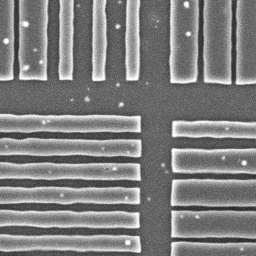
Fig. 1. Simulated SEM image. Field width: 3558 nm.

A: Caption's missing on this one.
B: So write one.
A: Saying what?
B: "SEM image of groups of lines, slits or small figures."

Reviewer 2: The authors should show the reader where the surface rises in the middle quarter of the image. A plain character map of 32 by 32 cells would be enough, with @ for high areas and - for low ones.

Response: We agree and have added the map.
@@-----@@@------@@@--------@@@@@
@@-----@@@------@@@--------@@@@@
@@-----@@@------@@@--------@@@@@
@@-----@@@------@@---------@@@@@
-----------------------------@@-
--------------------------------
--------------------------------
--------------------------------
--------------------------------
--------------------------------
--------------------------------
--------------------------------
--------------------------------
@@@@@@@@@@@@@@@@@@@-------------
@@@@@@@@@@@@@@@@@@@-------------
@@@@@@@@@@@@@@@@@@@--------@@@@@
@@@@@@@@@@@@@@@@@@@--------@@@@@
---------------------------@@@@@
--------------------------------
@@@@@@@@@@@@@@@@@@@-------------
@@@@@@@@@@@@@@@@@@@-------------
@@@@@@@@@@@@@@@@@@@--------@@@@@
@@--@@@@@@@@@@@@@@@--------@@@@@
---------------------------@@@@@
---------------------------@@@@@
@@@@@@@@@@@@@@@@@@@--------@@@@@
@@@@@@@@@@@@@@@@@@@--------@@@@@
@@@@@@@@@@@@@@@@@@@-------------
@@@@@@@@@@@@@@@@@@@-------------
---------------------------@@@@@
---------------------------@@@@@
@@@@@@@@@@@@@@@@@@@--------@@@@@